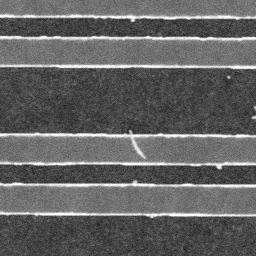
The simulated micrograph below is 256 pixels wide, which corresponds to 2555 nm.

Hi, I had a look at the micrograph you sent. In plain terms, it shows lines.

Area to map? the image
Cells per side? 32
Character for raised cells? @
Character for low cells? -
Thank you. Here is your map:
@@@@@@@@@@@@@@@@@@@@@@@@@@@@@@@@
@@@@@@@@@@@@@@@@@@@@@@@@@@@@@@@@
--------------------------------
--------------------------------
--------------------------------
@@@@@@@@@@@@@@@@@@@@@@@@@@@@@@@@
@@@@@@@@@@@@@@@@@@@@@@@@@@@@@@@@
@@@@@@@@@@@@@@@@@@@@@@@@@@@@@@@@
--------------------------------
--------------------------------
--------------------------------
--------------------------------
--------------------------------
--------------------------------
--------------------------------
--------------------------------
--------------------------------
@@@@@@@@@@@@@@@@@@@@@@@@@@@@@@@@
@@@@@@@@@@@@@@@@@@@@@@@@@@@@@@@@
@@@@@@@@@@@@@@@@@@@@@@@@@@@@@@@@
----@@@@@------@@@@@@@@@@@@@@@@@
--------------------------------
--------------------------------
@@@@@@@@@@@@@@@@@@@@@@@@@@@@@@@@
@@@@@@@@@@@@@@@@@@@@@@@@@@@@@@@@
@@@@@@@@@@@@@@@@@@@@@@@@@@@@@@@@
@@@@@@@@@@@@@@@@@@@@@@@@@@@@@@@@
--------------------------------
--------------------------------
--------------------------------
--------------------------------
--------------------------------